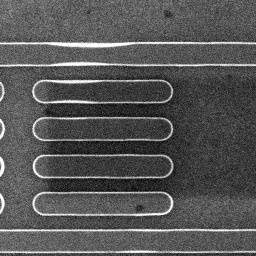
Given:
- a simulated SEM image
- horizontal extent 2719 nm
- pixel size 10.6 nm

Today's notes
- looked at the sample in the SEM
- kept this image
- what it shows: groups of lines, slits or small figures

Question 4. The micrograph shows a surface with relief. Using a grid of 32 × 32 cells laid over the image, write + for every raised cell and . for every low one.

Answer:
................................
................................
................................
................................
................................
.+++++..........++++++++++++++++
++++++++++++++++++++++++++++++++
++++++++++++++++++++++++++++++++
................................
................................
....+++++++++++++++++...........
....++++++++++++++++++..........
.....++++++++++++++++...........
................................
................................
....+++++++++++++++++...........
....++++++++++++++++++..........
.....++.........................
................................
.......+++++.++++++++...........
....++++++++++++++++++..........
....+++++++++++++++++...........
................................
................................
.....++++++++++++++++...........
....++++++++++++++++++..........
.....++++++++++++++++...........
................................
................................
++++++++++++++++++++++++++++++++
++++++++++++++++++++++++++++++++
...+++...++...........+++.......